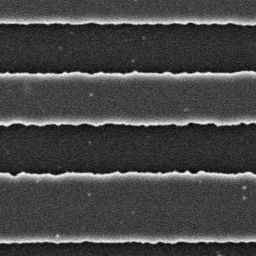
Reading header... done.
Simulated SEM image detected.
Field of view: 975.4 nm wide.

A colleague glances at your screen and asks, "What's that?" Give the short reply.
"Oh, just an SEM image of lines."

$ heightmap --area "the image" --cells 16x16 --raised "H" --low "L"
HHHHHHHHHHHHHHHH
LLLLLLLLLLLLLLLH
LLLLLLLLLLLLLLLL
LLLLLLLLLLLLLLLL
LLLLLLLLLLLLLLLH
HHHHHHHHHHHHHHHH
HHHHHHHHHHHHHHHH
HHHHHHHHHHHHHHHH
LLLLLLLLLLLLLLLL
LLLLLLLLLLLLLLLL
LLLLLLLLLLLLLLLL
HHHHHHHHHHHHHHHH
HHHHHHHHHHHHHHHH
HHHHHHHHHHHHHHHH
HHHHHHHHHHHHHHHH
LLLLLLLLLLLLLLLL